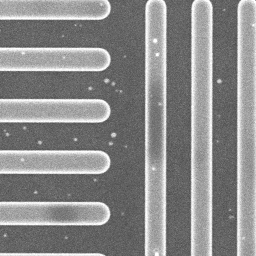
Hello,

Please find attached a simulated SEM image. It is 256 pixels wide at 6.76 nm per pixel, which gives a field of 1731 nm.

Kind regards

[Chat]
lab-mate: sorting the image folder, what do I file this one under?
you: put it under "groups of lines, slits or small figures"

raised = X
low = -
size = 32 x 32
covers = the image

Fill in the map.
XXXXXXXXXXXXXX----XXX---XX----XX
XXXXXXXXXXXXXX----XXX---XX----XX
------------------XXX---XX----XX
------------------XXX---XX----XX
------------------XXX---XX----XX
------------------XXX---XX----XX
XXXXXXXXXXXXX-----XXX---XX----XX
XXXXXXXXXXXXXX----XXX---XX----XX
XXXXXXXXXXXXX-----XXX---XX----XX
------------------XXX---XX----XX
------------------XXX---XX----XX
------------------XXX---XX----XX
------------------XXX---XX----XX
XXXXXXXXXXXXXX----XXX---XX----XX
XXXXXXXXXXXXXX----XXX---XX----XX
------------------XXX---XX----XX
------------------XXX---XX----XX
------------------XXX---XX----XX
------------------XXX---XX----XX
XXXXXXXXXXXXX-----XXX---XX----XX
XXXXXXXXXXXXXX----XXX---XX----XX
XXXXXXXXXXXXX-----XXX---XX----XX
------------------XXX---XX----XX
------------------XXX---XX----XX
------------------XXX---XX----XX
XXXXXXXXXXXXX-----XXX---XX----XX
XXXXXXXXXXXXXX----XXX---XX----XX
XXXXXXXXXXXXX-----XXX---XX----XX
------------------XXX---XX----XX
------------------XXX---XX----XX
------------------XXX---XX----XX
------------------XXX---XX----XX